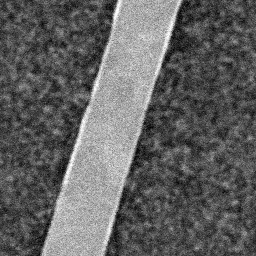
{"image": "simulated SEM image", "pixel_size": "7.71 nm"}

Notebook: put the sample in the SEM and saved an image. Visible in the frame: one or a few lines or trenches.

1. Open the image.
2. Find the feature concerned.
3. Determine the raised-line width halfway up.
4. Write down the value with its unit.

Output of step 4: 438 nanometers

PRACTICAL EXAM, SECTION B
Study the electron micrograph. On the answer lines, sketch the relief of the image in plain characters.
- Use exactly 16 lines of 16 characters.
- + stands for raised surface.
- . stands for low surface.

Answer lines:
.......++++.....
.......++++.....
.......++++.....
.......+++......
......++++......
......++++......
......+++.......
.....++++.......
.....++++.......
.....+++........
....++++........
....++++........
....+++.........
...++++.........
...++++.........
...++++.........